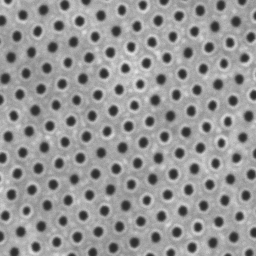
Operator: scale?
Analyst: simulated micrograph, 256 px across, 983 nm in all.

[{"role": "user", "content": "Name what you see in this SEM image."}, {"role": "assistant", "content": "a regular array of holes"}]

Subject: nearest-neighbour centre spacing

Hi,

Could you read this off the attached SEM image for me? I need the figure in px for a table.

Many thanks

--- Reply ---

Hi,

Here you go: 21.4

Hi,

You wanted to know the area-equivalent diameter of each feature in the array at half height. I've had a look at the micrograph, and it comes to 39.2 nm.